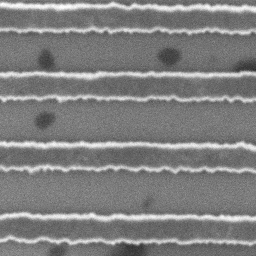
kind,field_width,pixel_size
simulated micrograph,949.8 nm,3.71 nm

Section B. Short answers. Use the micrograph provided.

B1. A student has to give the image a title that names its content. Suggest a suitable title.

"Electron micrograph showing lines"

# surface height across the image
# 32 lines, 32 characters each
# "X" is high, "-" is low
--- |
X-------------X-----------------
XXXXXXXXXXXXXXXXXXXXXXXXXXXXXXXX
XXXXXXXXXXXXXXXXXXXXXXXXXXXXXXXX
XXXXXXXXXXXXXXXXXXXXXXXXXXXXXXXX
--------------------------------
--------------------------------
--------------------------------
--------------------------------
--------------------------------
XXXXXXXXXXXXXXXXXXXXXXXXXXXXXXXX
XXXXXXXXXXXXXXXXXXXXXXXXXXXXXXXX
XXXXXXXXXXXXXXXXXXXXXXXXXXXXXXXX
-----------------X----XX--X---XX
--------------------------------
--------------------------------
--------------------------------
--------------------------------
--------------------------------
XXXXXXXXXXXXXXXXXXXXXXXXXXXXXXXX
XXXXXXXXXXXXXXXXXXXXXXXXXXXXXXXX
XXXXXXXXXXXXXXXXXXXXXXXXXXXXXXXX
--------------------------------
--------------------------------
--------------------------------
--------------------------------
--------------------------------
--------------------------------
XXXXXXXXXXXXXXXXXXXXXXXXXXXXXXXX
XXXXXXXXXXXXXXXXXXXXXXXXXXXXXXXX
XXXXXXXXXXXXXXXXXXXXXXXXXXXXXXXX
-------------------------------X
--------------------------------